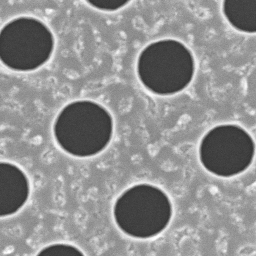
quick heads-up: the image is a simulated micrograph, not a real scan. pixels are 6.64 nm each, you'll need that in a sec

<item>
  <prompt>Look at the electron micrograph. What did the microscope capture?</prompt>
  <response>holes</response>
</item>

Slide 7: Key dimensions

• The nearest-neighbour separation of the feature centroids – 680 nanometres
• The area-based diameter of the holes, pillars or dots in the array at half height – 370 nm